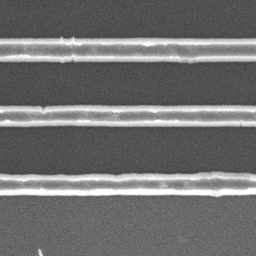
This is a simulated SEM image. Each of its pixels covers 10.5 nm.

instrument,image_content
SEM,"one or a few lines or trenches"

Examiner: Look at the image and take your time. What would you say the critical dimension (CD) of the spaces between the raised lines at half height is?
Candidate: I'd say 523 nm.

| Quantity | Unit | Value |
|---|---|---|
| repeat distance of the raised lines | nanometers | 708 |